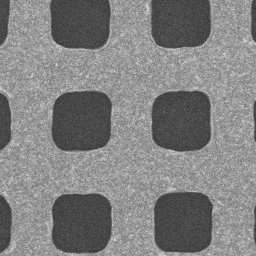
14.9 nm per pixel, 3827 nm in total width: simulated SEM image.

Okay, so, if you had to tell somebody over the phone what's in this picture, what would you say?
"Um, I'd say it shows holes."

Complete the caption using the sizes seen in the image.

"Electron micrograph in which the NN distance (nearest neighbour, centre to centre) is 101 pixels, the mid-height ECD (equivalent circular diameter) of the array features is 0.969 µm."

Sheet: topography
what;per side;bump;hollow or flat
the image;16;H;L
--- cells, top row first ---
LHHLLLLHHLLLLHHH
LHHLLLLHHLLLLHHH
HHHLLLLHHHLLLHHH
HHHHHHHHHHHHHHHH
HHHHHHHHHHHHHHHH
HHHHHHHHHHHHHHHH
LHHLLLLHHHLLLHHH
LHHLLLLHHLLLLHHH
LHHLLLLHHHLLLHHH
HHHHHHHHHHHLHHHH
HHHHHHHHHHHHHHHH
HHHHHHHHHHHHHHHH
HHHHLLLHHHLLLHHH
LHHLLLLHHHLLLHHH
LHHLLLLHHHLLLHHH
HHHHLLHHHHLLLHHH